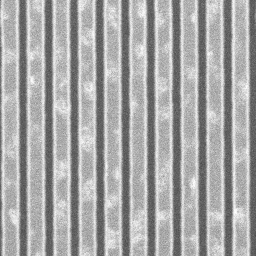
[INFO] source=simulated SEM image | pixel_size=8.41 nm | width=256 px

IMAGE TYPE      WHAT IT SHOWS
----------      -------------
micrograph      parallel lines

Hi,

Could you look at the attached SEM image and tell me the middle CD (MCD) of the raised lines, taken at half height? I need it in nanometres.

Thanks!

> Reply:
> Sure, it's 134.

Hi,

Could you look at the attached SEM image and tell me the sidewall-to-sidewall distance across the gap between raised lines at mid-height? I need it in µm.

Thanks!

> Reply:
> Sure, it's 0.0788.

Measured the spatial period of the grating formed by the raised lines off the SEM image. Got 215 nm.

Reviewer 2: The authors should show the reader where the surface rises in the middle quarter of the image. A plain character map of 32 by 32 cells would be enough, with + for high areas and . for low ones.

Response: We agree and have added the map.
+...++++..++++...++++..++++...++
+...++++..++++...+++...++++...++
+...++++..++++...+++...++++...++
+...++++..++++...+++...++++...++
+...++++..++++...+++...++++...++
+...++++..++++...+++...++++...++
+...++++..++++...+++...++++..+++
+...++++..++++...+++...++++..+++
+...++++..++++...+++...++++...++
+...++++..++++...++++..++++...++
+...++++..++++...+++...++++...++
+...++++..++++...+++...++++...++
+...++++..++++...++++..++++...++
+...++++..++++...+++...++++...++
+...++++..++++...+++...++++...++
+...++++..++++...+++...++++...++
+...++++..++++...+++...++++...++
+...++++..++++...+++...++++...++
+...++++..++++...+++...++++...++
+...++++..++++...+++...++++...++
+...++++..++++...+++...++++...++
+...++++..++++...++++..++++...++
+...++++..++++...+++...++++...++
+...++++..++++...+++...++++...++
+...++++..++++...++++..++++...++
+...++++..++++...+++...++++...++
+...++++..++++...+++...++++...++
+...++++..++++...+++...++++..+++
+...++++..++++...+++...++++...++
+...++++..++++...+++...++++...++
+...++++..++++...+++...++++...++
+...++++..++++...++++..++++...++